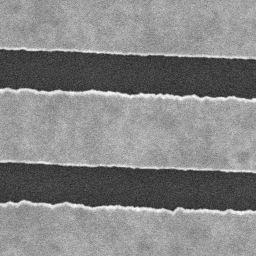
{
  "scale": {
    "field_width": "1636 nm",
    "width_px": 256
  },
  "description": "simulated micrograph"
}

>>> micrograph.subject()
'lines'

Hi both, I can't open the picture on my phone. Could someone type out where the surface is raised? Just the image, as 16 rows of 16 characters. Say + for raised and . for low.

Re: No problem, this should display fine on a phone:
++++++++++++++++
++++++++++++++++
++++++++++++++++
...........+++++
................
................
++++++++++++++++
++++++++++++++++
++++++++++++++++
++++++++++++++++
........++++++++
................
................
++++++++++++++++
++++++++++++++++
++++++++++++++++